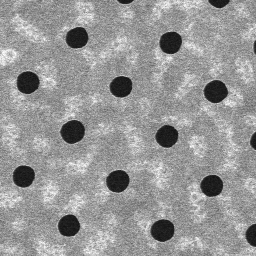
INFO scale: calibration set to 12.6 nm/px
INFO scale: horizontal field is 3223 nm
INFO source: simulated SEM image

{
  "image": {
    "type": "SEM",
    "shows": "a regular array of holes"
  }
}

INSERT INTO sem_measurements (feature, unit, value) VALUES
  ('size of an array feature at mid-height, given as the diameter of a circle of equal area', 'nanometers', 288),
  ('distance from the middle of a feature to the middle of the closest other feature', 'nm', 833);